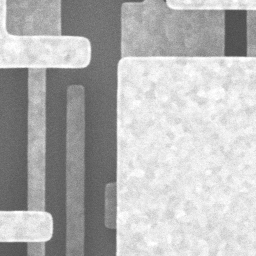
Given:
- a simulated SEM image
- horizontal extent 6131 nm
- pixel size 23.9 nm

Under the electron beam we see wiring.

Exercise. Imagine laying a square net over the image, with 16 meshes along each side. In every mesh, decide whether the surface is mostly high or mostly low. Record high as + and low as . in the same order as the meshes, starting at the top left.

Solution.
...........+++++
................
+++++...........
++++++..........
.......+++++++++
.......+++++++++
.......+++++++++
.......+++++++++
.......+++++++++
.......+++++++++
.......+++++++++
.......+++++++++
.......+++++++++
+++....+++++++++
+++....+++++++++
.......+++++++++